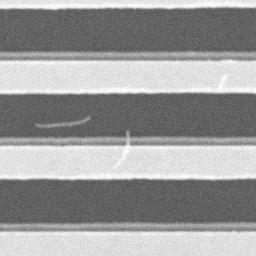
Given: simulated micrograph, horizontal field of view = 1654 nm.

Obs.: lines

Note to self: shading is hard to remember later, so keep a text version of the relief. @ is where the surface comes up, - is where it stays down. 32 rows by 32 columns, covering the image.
@@@@@@@@@@@@@@@@@@@@@@@@@@@@@@@@
--------------------------------
--------------------------------
--------------------------------
--------------------------------
--------------------------------
--------------------------------
--------------------------------
@@@@@@@@@@@@@@@@@@@@@@@@@@@@@@@@
@@@@@@@@@@@@@@@@@@@@@@@@@@@@@@@@
@@@@@@@@@@@@@@@@@@@@@@@@@@@@@@@@
@@@@@@@@@@@@@@@@@@@@------@@---@
--------------------------------
--------------------------------
--------------------------------
--------------------------------
--------------------------------
--------------------------------
@@@@@@@@@@@@@@@@@@@@@@@@@@@@@@@@
@@@@@@@@@@@@@@@@@@@@@@@@@@@@@@@@
@@@@@@@@@@@@@@@@@@@@@@@@@@@@@@@@
@@@@@@@@@@@@@@@@@@@@@@@@@@@@@@@@
--------------------------------
--------------------------------
--------------------------------
--------------------------------
--------------------------------
--------------------------------
--------------------------------
@@@@@@@@@@@@@@@@@@@@@@@@@@@@@@@@
@@@@@@@@@@@@@@@@@@@@@@@@@@@@@@@@
@@@@@@@@@@@@@@@@@@@@@@@@@@@@@@@@